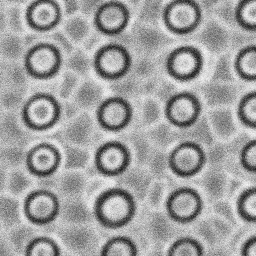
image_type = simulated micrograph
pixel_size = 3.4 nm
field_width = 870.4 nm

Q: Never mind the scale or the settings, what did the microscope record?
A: a regular array of ring-shaped grooves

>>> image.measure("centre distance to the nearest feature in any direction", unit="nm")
159